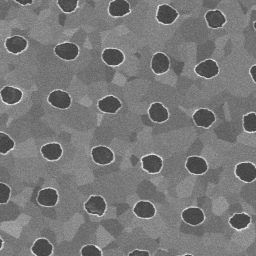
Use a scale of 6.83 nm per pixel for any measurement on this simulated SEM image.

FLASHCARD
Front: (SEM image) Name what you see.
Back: a regular array of holes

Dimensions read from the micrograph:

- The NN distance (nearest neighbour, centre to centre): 47 px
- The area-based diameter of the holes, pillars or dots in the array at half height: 136 nm